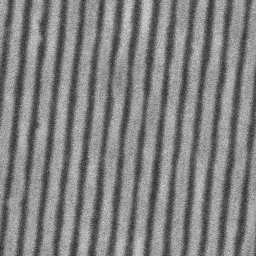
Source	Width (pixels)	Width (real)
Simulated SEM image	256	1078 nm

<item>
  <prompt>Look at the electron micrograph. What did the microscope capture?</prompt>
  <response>parallel lines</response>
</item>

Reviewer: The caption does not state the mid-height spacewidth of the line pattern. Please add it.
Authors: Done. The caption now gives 37.6 nanometers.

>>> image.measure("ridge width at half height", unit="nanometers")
41.8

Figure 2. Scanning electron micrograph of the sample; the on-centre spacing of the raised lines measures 76.5 nanometres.